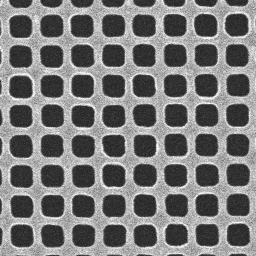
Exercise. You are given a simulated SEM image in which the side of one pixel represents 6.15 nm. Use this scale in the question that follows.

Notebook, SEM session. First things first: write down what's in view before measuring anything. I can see a regular array of holes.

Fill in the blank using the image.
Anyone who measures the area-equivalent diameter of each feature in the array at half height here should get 0.147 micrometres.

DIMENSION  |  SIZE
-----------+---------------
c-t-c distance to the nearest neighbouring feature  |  183 nanometers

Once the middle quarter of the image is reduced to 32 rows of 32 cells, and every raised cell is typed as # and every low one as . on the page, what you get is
###....####...#####...####....##
################################
###########################.####
##.....###.....##.....###.....##
##.....###.....##......##......#
##.....###.....##......##......#
##......##.....##......##......#
##.....###.....###.....##.....##
################################
################################
###..######...####....####....##
##......##.....##......##......#
##......##.....##......##......#
##......##.....##......##......#
##......##.....###.....##......#
###....####....###....####....##
################################
##########################...###
##.....###.....###....###.....##
##......##.....##......##......#
##......##.....##......##......#
##......##......#......##......#
##.....####....###.....###....##
################################
################################
###....###....####....####....##
##.....###.....##......##......#
##......##.....##......##......#
##......##......#......##......#
##......##.....###.....##......#
###....####...#####...#####...##
################################